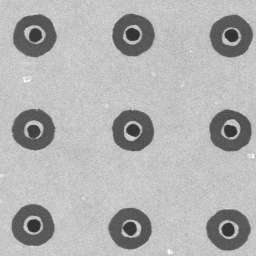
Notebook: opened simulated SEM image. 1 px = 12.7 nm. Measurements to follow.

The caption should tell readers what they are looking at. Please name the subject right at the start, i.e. a regular array of ring-shaped grooves with a dot in the middle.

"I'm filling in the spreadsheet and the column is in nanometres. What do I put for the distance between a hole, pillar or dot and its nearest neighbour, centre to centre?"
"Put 1210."